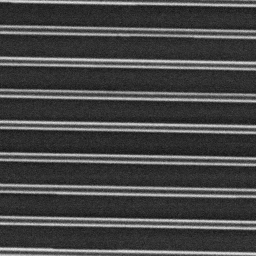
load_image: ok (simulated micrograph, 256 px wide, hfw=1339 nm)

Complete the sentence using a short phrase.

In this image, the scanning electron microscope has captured parallel lines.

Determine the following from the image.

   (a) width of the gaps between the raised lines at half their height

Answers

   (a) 128 nm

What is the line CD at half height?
36.6 nm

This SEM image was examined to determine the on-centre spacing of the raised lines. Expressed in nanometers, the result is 166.